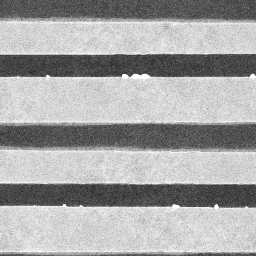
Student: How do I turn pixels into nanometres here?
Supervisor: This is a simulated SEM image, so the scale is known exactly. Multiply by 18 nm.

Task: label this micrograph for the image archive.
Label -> lines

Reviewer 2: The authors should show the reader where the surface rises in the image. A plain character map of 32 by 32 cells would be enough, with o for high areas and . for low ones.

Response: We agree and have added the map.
................................
................................
................................
oooooooooooooooooooooooooooooooo
oooooooooooooooooooooooooooooooo
oooooooooooooooooooooooooooooooo
oooooooooooooooooooooooooooooooo
................................
................................
...............oooo............o
oooooooooooooooooooooooooooooooo
oooooooooooooooooooooooooooooooo
oooooooooooooooooooooooooooooooo
oooooooooooooooooooooooooooooooo
oooooooooooooooooooooooooooooooo
................................
................................
................................
................................
oooooooooooooooooooooooooooooooo
oooooooooooooooooooooooooooooooo
oooooooooooooooooooooooooooooooo
oooooooooooooooooooooooooooooooo
................................
................................
................................
oooooooooooooooooooooooooooooooo
oooooooooooooooooooooooooooooooo
oooooooooooooooooooooooooooooooo
oooooooooooooooooooooooooooooooo
oooooooooooooooooooooooooooooooo
................................